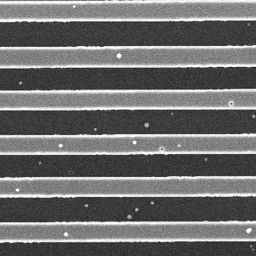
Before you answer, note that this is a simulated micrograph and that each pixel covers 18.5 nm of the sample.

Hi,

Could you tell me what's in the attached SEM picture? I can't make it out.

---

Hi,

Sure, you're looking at lines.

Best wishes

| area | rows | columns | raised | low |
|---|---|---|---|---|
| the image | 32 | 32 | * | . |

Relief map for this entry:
********************************
********************************
********************.***........
................................
................................
................................
********************************
********************************
................................
................................
................................
********************************
********************************
********************************
................................
................................
................................
********************************
********************************
................................
................................
................................
********************************
********************************
***********************.*.......
................................
................................
................................
********************************
********************************
................................
................................